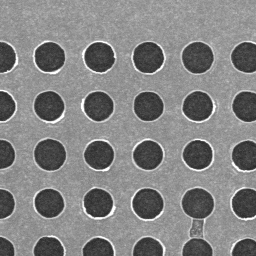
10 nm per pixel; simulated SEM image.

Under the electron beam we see a regular array of holes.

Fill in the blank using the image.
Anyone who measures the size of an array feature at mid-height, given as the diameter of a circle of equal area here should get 306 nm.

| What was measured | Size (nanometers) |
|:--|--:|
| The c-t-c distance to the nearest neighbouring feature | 487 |